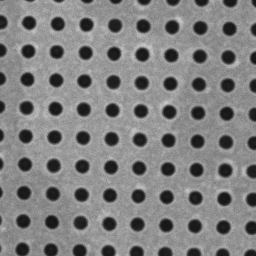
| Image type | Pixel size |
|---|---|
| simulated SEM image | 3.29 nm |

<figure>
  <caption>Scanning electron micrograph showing a regular array of holes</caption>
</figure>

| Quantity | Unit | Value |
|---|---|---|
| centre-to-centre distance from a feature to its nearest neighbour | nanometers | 92.8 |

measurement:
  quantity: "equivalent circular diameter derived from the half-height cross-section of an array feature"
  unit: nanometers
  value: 46.7